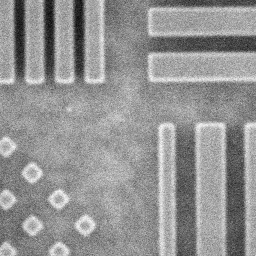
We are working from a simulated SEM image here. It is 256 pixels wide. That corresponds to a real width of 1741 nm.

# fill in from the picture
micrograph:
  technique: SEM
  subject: groups of lines, slits or small figures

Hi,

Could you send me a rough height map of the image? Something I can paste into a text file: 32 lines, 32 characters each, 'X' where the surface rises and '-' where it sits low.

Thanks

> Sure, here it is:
XX-XX--XX--XX-------------------
XX-XX--XX--XX------XXXXXXXXXXXXX
XX-XX--XX--XX------XXXXXXXXXXXXX
XX-XX--XX--XX------XXXXXXXXXXXXX
XX-XX--XX--XX-------------------
XX-XX--XX--XX-------------------
XX-XX--XX--XX-------------------
XX-XX--XX--XX------XXXXXXXXXXXXX
XX-XX--XX--XX------XXXXXXXXXXXXX
XX-XX--XX--XX------XXXXXXXXXXXXX
--------------------------------
--------------------------------
--------------------------------
--------------------------------
--------------------------------
--------------------------------
--------------------XX---XXX---X
X-------------------XX---XXX---X
XX------------------XX---XXX---X
--------------------XX---XXX---X
--------------------XX---XXX---X
---XX---------------XX---XXX---X
--------------------XX---XXX---X
--------------------XX---XXX---X
XX----XX------------XX---XXX---X
XX-----X------------XX---XXX---X
--------------------XX---XXX---X
---XX-----X---------XX---XXX---X
---XX-----XX--------XX---XXX---X
--------------------XX---XXX---X
-------X------------XX---XXX---X
XX----XX------------XX---XXX---X